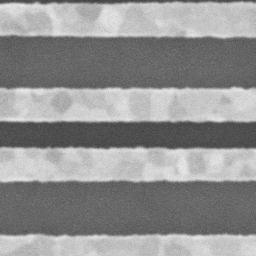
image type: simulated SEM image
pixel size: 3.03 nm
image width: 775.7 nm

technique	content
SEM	lines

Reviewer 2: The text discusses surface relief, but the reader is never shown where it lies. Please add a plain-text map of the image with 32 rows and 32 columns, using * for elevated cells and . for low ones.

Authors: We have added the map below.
......*.*.*.....****************
********************************
********************************
********************************
.........**.********************
................................
................................
................................
................................
................................
................................
********************************
********************************
********************************
********************************
................................
................................
................................
*...............................
********************************
********************************
********************************
*********.****..****.***..**.**.
................................
................................
................................
................................
................................
................................
...***......*...****.***..****.*
********************************
********************************